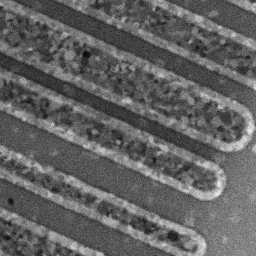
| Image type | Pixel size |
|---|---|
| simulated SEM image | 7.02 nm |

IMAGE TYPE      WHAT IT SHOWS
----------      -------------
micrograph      one or a few lines or trenches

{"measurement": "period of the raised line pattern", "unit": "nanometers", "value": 441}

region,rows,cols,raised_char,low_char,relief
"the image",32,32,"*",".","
*........***********...........*
***.........***********.........
*****.........***********.......
********........***********.....
**********........***********...
************.........**********.
..************.........*********
....*************........*******
......*************........*****
*.......*************.........**
***.......*************.........
******.......*************......
********.......*************....
.*********.......*************..
...*********.......************.
.....**********.......*********.
........*********.......*******.
..........*********.......*****.
............*********...........
**............*********.........
****............**********......
******.............********.....
..*******............*******....
....*******............****.....
.......******...................
.........******.................
...........******...............
**...........*******............
****............******..........
*******...........******........
*********...........*****.......
***********...........***.......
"